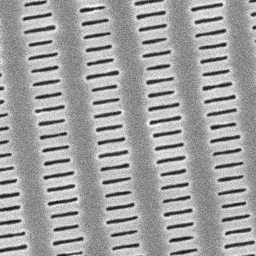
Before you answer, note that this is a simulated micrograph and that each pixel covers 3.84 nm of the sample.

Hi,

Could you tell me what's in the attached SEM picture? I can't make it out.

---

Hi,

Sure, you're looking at a regular array of holes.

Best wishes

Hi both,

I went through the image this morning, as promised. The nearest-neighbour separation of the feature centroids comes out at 51.1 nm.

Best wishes